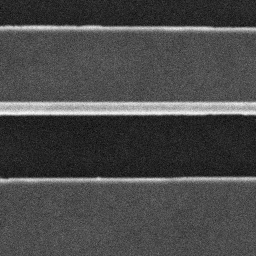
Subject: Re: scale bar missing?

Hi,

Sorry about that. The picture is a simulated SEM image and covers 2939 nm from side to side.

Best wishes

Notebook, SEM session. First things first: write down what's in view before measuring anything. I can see lines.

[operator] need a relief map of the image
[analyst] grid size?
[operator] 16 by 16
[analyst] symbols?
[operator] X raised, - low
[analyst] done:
----------------
----------------
XXXXXXXXXXXXXXXX
XXXXXXXXXXXXXXXX
XXXXXXXXXXXXXXXX
XXXXXXXXXXXXXXXX
XXXXXXXXXXXXXXXX
----------------
----------------
----------------
----------------
XXXXXXXXXXXXXXXX
XXXXXXXXXXXXXXXX
XXXXXXXXXXXXXXXX
XXXXXXXXXXXXXXXX
XXXXXXXXXXXXXXXX